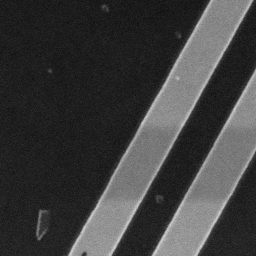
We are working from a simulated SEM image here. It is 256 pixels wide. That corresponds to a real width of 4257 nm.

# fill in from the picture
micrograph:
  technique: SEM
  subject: lines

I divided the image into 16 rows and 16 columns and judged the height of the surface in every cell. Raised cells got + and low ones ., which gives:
.............+++
............+++.
............++..
...........+++..
...........++...
..........+++..+
..........++...+
.........+++..++
........+++...++
........+++..+++
.......+++...++.
.......++...+++.
......+++..+++..
......++...+++..
.....+++..+++...
.....++...+++...